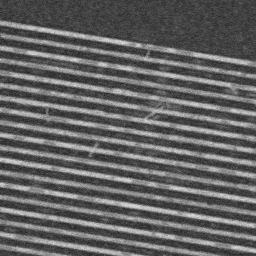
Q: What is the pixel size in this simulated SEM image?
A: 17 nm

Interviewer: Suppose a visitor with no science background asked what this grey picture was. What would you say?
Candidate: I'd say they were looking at parallel lines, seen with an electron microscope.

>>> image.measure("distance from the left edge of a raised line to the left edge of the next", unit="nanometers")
208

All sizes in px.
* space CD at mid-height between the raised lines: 9.13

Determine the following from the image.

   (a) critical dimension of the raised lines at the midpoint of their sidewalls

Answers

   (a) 60.8 nm